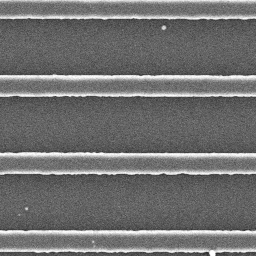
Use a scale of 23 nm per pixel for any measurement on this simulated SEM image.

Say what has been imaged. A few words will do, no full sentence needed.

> lines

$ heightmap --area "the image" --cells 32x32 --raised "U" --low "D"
UUUUUUUUUUUUUUUUUUUUUUUUUUUUUUUU
UUUUUUUUUUUUUUUUUUUUUUUUUUUUUUUU
DDDDDDDDDDDDDDDDDDDDDDDDDDDDDDDD
DDDDDDDDDDDDDDDDDDDDDDDDDDDDDDDD
DDDDDDDDDDDDDDDDDDDDDDDDDDDDDDDD
DDDDDDDDDDDDDDDDDDDDDDDDDDDDDDDD
DDDDDDDDDDDDDDDDDDDDDDDDDDDDDDDD
DDDDDDDDDDDDDDDDDDDDDDDDDDDDDDDD
DDDDDDDDDDDDDDDDDDDDDDDDDDDDDDDD
UUUDUUUUDDDDDDDDDDDDDDDDDUDDDDDD
UUUUUUUUUUUUUUUUUUUUUUUUUUUUUUUU
UUUUUUUUUUUUUUUUUUUUUUUUUUUUUUUU
DDDDDDDDDDDDDDDDDDDDDDDDDDDDDDDD
DDDDDDDDDDDDDDDDDDDDDDDDDDDDDDDD
DDDDDDDDDDDDDDDDDDDDDDDDDDDDDDDD
DDDDDDDDDDDDDDDDDDDDDDDDDDDDDDDD
DDDDDDDDDDDDDDDDDDDDDDDDDDDDDDDD
DDDDDDDDDDDDDDDDDDDDDDDDDDDDDDDD
DDDDDDDDDDDDDDDDDDDDDDDDDDDDDDDD
UUUUUUUUUUUUUUUUUUUUUUUUUUUUUUUU
UUUUUUUUUUUUUUUUUUUUUUUUUUUUUUUU
UUUUUUUUUUUUUUUUUUUUUUUUUUUUUUUU
DDDDDDDDDDDDDDDDDDDDDDDDDDDDDDDD
DDDDDDDDDDDDDDDDDDDDDDDDDDDDDDDD
DDDDDDDDDDDDDDDDDDDDDDDDDDDDDDDD
DDDDDDDDDDDDDDDDDDDDDDDDDDDDDDDD
DDDDDDDDDDDDDDDDDDDDDDDDDDDDDDDD
DDDDDDDDDDDDDDDDDDDDDDDDDDDDDDDD
DDDDDDDDDDDDDDDDDDDDDDDDDDDDDDDD
UUUUUUUUUUUUUUUUUUUUUUUUUUUUUUUU
UUUUUUUUUUUUUUUUUUUUUUUUUUUUUUUU
DDDDDDDDDDDDDDDDDDDDDDDDDDUDDDDD